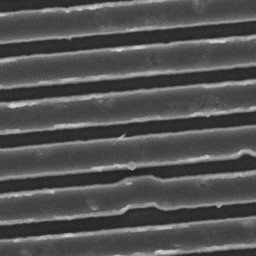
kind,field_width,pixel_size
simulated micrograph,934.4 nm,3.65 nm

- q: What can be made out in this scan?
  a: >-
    parallel lines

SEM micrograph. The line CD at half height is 30.7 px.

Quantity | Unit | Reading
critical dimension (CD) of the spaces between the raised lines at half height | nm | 55.9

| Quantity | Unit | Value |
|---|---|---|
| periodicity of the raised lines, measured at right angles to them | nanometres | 164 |